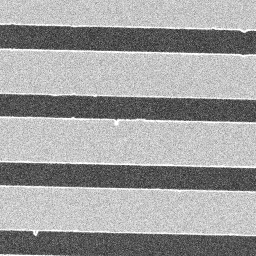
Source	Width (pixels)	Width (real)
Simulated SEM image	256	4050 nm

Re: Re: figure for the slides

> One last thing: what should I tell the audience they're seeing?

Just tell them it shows one or a few lines or trenches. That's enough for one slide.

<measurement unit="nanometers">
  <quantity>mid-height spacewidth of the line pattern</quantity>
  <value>686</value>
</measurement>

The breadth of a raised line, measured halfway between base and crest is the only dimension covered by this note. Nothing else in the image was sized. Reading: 397 nanometres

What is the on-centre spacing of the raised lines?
1080 nanometres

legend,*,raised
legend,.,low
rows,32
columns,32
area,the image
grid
................................
................................
................................
********************............
********************************
********************************
................****************
................................
................................
................................
................................
................................
********************************
********************************
********************************
................................
................................
................................
................................
................................
*************...................
********************************
********************************
...........*********************
................................
................................
................................
................................
................................
********************************
********************************
********************************